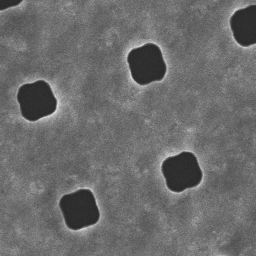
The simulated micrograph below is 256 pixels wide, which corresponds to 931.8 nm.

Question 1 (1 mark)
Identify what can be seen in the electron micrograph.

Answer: holes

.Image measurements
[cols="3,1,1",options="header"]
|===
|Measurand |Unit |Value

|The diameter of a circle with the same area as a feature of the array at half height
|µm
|0.142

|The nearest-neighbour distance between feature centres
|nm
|404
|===